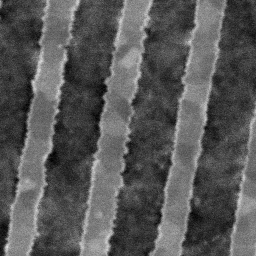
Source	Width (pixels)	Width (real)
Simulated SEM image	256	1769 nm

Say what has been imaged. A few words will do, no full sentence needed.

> one or a few lines or trenches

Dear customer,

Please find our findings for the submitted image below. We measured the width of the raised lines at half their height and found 177 nanometers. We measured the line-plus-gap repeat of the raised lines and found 0.51 um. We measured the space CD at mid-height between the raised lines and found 324 nanometres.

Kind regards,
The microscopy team